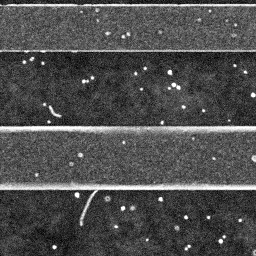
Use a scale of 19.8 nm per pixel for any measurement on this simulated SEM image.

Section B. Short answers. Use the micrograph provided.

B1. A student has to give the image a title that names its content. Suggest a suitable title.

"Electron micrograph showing lines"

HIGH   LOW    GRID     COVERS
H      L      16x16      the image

HHHHHHHHHHHHHHHH
HHHHHHHHHHHHHHHH
HHHHHHHHHHHHHHHH
LLLLLLLLLLLLLLLL
LLLLLLLLLLLLLLLL
LLLLLLLLLLLLLLLL
LLLLLLLLLLLLLLLL
LLLLLLLLLLLLLLLL
HHHHHHHHHHHHHHHH
HHHHHHHHHHHHHHHH
HHHHHHHHHHHHHHHH
HHHHHHHHHHHHHHHH
LLLLLLLLLLLLLLLL
LLLLLLLLLLLLLLLL
LLLLLLLLLLLLLLLL
LLLLLLLLLLLLLLLL